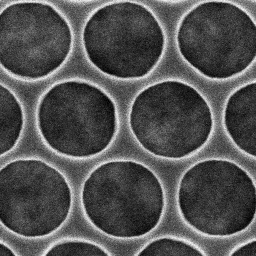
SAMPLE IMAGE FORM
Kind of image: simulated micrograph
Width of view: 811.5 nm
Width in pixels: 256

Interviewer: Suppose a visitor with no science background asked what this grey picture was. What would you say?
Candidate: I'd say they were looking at holes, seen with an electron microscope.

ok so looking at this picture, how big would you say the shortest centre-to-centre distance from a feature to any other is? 0.291 microns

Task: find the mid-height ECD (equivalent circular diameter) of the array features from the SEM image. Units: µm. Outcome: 0.248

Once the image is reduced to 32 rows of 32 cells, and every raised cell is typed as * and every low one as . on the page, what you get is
**....********...********....***
.......*****.......*****.......*
........***........****........*
.........**.........**..........
.........*..........**..........
.........**.........**..........
.........**.........***.........
........***.........***.........
*......*****.......*****.......*
**....********....********...***
*******....*********...********.
.*****.......*****.......*****..
..***.........***.........***...
...**.........***.........**....
...**..........*..........**....
...**..........*..........**....
...**.........***.........***...
..****........***.........***...
.******......*****.......*****..
*********...********...*********
*.....*******....********....***
.......*****.......****........*
........***.........***........*
.........*..........**..........
.........*..........**..........
.........*..........**..........
.........**.........***.........
........***.........***.........
*......*****.......*****.......*
***..*********...***************
*******....********.....*******.
.*****.......*****.......****...